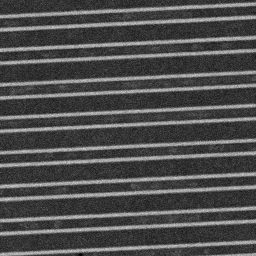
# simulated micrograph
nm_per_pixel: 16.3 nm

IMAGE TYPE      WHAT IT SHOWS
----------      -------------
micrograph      parallel lines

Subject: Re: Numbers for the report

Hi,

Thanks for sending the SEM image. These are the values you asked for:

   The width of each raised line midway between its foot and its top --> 0.359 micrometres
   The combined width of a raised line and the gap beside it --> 556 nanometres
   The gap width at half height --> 13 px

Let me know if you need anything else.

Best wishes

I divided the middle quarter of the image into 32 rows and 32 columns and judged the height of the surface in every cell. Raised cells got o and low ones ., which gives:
oooooooooooooooooooooooooooooooo
oooooooooooooooooooooooooooooooo
oooooooooooooooooooooooooooooooo
oooooooooooooooooo..............
................................
................................
...........................ooooo
.......ooooooooooooooooooooooooo
oooooooooooooooooooooooooooooooo
oooooooooooooooooooooooooooooooo
oooooooooooooooooooooooooooooooo
ooooooooooooooooooooooo.........
ooo.............................
................................
................................
............oooooooooooooooooooo
oooooooooooooooooooooooooooooooo
oooooooooooooooooooooooooooooooo
oooooooooooooooooooooooooooooooo
oooooooooooooooooooooooooooooooo
oooooooooooooooooo..............
................................
................................
......................oooooooooo
..oooooooooooooooooooooooooooooo
oooooooooooooooooooooooooooooooo
oooooooooooooooooooooooooooooooo
oooooooooooooooooooooooooooooooo
oooooooooooooooooooooooooooo....
oooooooo........................
................................
................................